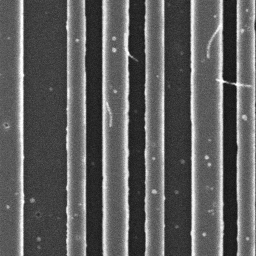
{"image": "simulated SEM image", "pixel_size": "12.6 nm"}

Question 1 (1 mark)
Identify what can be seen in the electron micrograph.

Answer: lines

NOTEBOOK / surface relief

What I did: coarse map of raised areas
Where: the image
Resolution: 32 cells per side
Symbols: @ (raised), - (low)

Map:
@@@-----@@@--@@@--@@----@@@@--@@
@@@-----@@@--@@@--@@----@@@@--@@
@@@-----@@@--@@@--@@----@@@@--@@
@@@-----@@@--@@@--@@----@@@@--@@
@@@-----@@@--@@@--@@----@@@@--@@
@@@-----@@@--@@@--@@----@@@@--@@
@@@-----@@@--@@@--@@----@@@@--@@
@@@-----@@@--@@@--@@----@@@@--@@
@@@-----@@@--@@@--@@----@@@@--@@
@@@-----@@@--@@@--@@----@@@@--@@
@@@-----@@@--@@@--@@----@@@@--@@
@@@-----@@@--@@@--@@----@@@@--@@
@@@-----@@@--@@@--@@----@@@@--@@
@@@-----@@@--@@@--@@----@@@@--@@
@@@-----@@@--@@@--@@----@@@@--@@
@@@-----@@@--@@@--@@----@@@@--@@
@@@-----@@@--@@@--@@----@@@@--@@
@@@-----@@@--@@@--@@----@@@@--@@
@@@-----@@@--@@@--@@----@@@@--@@
@@@-----@@@--@@@--@@----@@@@--@@
@@@-----@@@--@@@--@@----@@@@--@@
@@@-----@@@--@@@--@@----@@@@--@@
@@@-----@@@--@@@--@@----@@@@--@@
@@@-----@@@--@@@--@@----@@@@--@@
@@@-----@@@--@@@--@@----@@@@--@@
@@@-----@@@--@@@--@@----@@@@--@@
@@@-----@@@--@@@--@@----@@@@--@@
@@@-----@@@--@@@--@@----@@@@--@@
@@@-----@@@--@@@--@@@---@@@@--@@
@@@-----@@@--@@@--@@----@@@@--@@
@@@-----@@@--@@@--@@----@@@@--@@
@@@-----@@@--@@@--@@----@@@@--@@